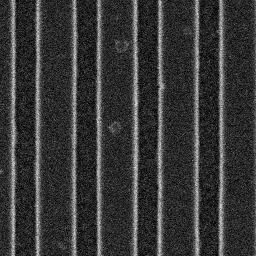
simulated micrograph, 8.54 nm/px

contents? parallel lines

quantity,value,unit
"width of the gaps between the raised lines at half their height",0.203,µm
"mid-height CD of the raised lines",321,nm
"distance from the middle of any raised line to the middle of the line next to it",0.522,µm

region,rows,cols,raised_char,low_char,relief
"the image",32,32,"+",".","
++...++++...+++++...+++++...++++
++...++++...+++++...+++++...++++
++...++++...+++++...+++++...++++
++...++++...+++++...+++++...++++
++...++++...+++++...+++++...++++
++...++++...+++++...+++++...++++
++...++++...+++++...+++++...++++
++...++++...+++++...+++++...++++
++...++++...+++++...+++++...++++
++...++++...+++++...+++++...++++
++...++++...+++++...+++++...++++
++...++++...+++++...+++++...++++
++...++++...+++++...+++++...++++
++...++++...+++++...+++++...++++
++...++++...+++++...+++++...++++
++...++++...+++++...+++++...++++
++...++++...+++++...+++++...++++
++...++++...+++++...+++++...++++
++...++++...+++++...+++++...++++
++...++++...+++++...+++++...++++
++...++++...+++++...+++++...++++
++...++++...+++++...+++++...++++
++...++++...+++++...+++++...++++
++...++++...+++++...+++++...++++
++...++++...+++++...+++++...++++
++...++++...+++++...+++++...++++
++...++++...+++++...+++++...++++
++...++++...+++++...+++++...++++
++...++++...+++++...+++++...++++
++...++++...+++++...+++++...++++
++...++++...+++++...+++++...++++
++...++++...+++++...+++++...++++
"